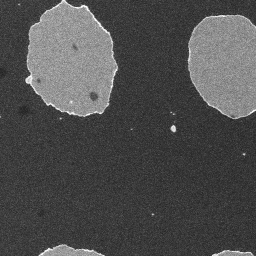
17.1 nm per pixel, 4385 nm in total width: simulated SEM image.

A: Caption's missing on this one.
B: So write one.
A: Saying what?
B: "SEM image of raised bodies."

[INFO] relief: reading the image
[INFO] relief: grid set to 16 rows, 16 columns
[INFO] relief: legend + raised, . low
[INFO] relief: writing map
...++...........
..++++......++++
..+++++.....++++
..+++++.....++++
..+++++.....++++
..+++++.....++++
...++++......+++
................
................
................
................
................
................
................
................
...++...........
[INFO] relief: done